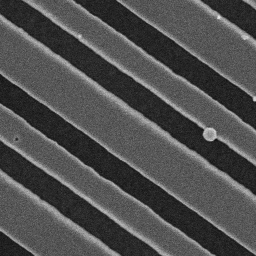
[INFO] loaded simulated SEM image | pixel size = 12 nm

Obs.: lines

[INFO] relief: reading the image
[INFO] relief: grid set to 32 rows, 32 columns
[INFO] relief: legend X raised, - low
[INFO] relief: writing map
----XXXXXX-----XXXXXXXXXXX-----X
-----XXXXXX------XXXXXXXXXX-----
X-----XXXXXXX-----XXXXXXXXXX----
XX------XXXXXX-----XXXXXXXXXXX--
XXXX-----XXXXXXX-----XXXXXXXXXX-
XXXXX------XXXXXX-----XXXXXXXXXX
XXXXXXX-----XXXXXX------XXXXXXXX
XXXXXXXX-----XXXXXXX-----XXXXXXX
XXXXXXXXX------XXXXXX-----XXXXXX
XXXXXXXXXXX-----XXXXXX------XXXX
--XXXXXXXXXX------XXXXXX-----XXX
---XXXXXXXXXXX-----XXXXXX------X
-----XXXXXXXXXX-----XXXXXXX-----
X-----XXXXXXXXXX------XXXXXX----
XX------XXXXXXXXXX-----XXXXXXX--
XXXX-----XXXXXXXXXX------XXXXXX-
XXXXX-----XXXXXXXXXXX----XXXXXXX
XXXXXX------XXXXXXXXXX----XXXXXX
-XXXXXXX-----XXXXXXXXXXX-----XXX
---XXXXXX-----XXXXXXXXXXX-----XX
----XXXXXXX-----XXXXXXXXXX------
------XXXXXX-----XXXXXXXXXXX----
XX-----XXXXXXX-----XXXXXXXXXX---
XXX------XXXXXX-----XXXXXXXXXXX-
XXXXX-----XXXXXX------XXXXXXXXXX
XXXXXX-----XXXXXXX-----XXXXXXXXX
XXXXXXX------XXXXXX-----XXXXXXXX
XXXXXXXXX-----XXXXXX------XXXXXX
XXXXXXXXXX-----XXXXXXX-----XXXXX
-XXXXXXXXXXX-----XXXXXX------XXX
--XXXXXXXXXXX-----XXXXXXX-----XX
----XXXXXXXXXX------XXXXXX-----X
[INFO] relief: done